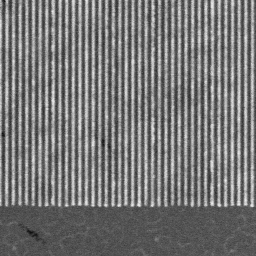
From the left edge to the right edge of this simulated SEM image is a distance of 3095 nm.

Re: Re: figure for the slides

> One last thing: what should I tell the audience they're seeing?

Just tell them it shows parallel lines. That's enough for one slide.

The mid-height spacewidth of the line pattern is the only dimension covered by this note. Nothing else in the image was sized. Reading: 62 nm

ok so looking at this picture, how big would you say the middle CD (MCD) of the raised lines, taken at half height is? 18.1 nm